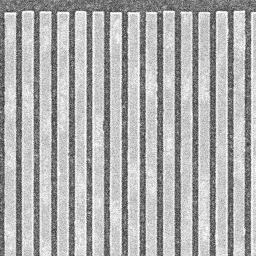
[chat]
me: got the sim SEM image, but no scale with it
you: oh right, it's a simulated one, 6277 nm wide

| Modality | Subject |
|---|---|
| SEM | parallel lines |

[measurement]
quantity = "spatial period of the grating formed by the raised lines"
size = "431 nm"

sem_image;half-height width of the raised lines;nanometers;251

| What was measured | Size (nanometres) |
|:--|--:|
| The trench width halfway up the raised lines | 187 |